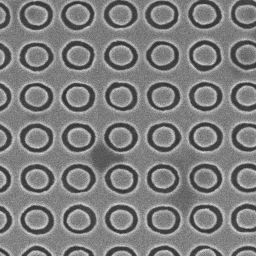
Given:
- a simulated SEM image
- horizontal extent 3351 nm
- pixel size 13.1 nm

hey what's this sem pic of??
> a regular array of ring-shaped grooves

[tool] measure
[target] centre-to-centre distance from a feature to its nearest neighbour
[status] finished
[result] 533 nm